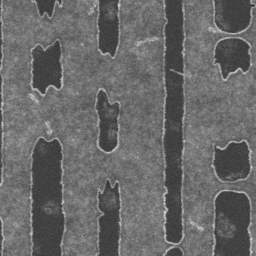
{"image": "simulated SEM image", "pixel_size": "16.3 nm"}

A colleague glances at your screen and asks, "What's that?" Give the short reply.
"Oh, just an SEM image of one or a few lines or trenches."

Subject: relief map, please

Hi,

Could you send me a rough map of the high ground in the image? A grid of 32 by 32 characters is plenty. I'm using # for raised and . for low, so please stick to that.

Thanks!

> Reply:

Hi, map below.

#####..#####...######..####.....
#####..#####...######..####....#
############...######..####....#
############...######..####....#
############...######..#########
#######.####...######..####....#
####....#####..######..####....#
####....#############..####....#
####....#############..#####...#
####....#############..#####.###
####....#############..#########
#####.######.########..#########
############..#######..#########
############...######..#########
############...######..#########
############...######..#########
############...######..#########
#####.######...#####...#########
####....#####.#######..#####...#
####....#############..####....#
####....#############..####....#
####....#############..####....#
####....#############..#####..##
####....#####..######..#########
####....####...######..####....#
####....####...######..####....#
####....#####..######..####....#
####....####...######..####....#
####....####...######..####....#
####....####...######..####....#
####....####...######.#####....#
####....####...######..####....#